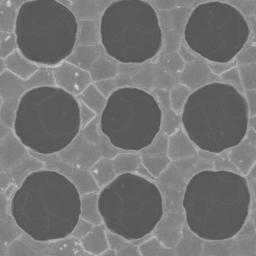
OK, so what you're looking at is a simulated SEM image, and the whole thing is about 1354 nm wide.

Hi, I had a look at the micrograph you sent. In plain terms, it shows holes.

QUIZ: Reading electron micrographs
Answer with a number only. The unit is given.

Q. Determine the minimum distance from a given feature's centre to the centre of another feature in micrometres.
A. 0.445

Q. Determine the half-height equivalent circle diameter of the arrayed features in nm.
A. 351